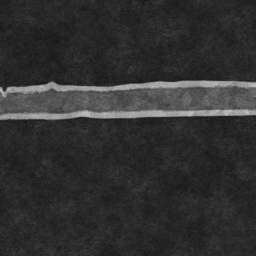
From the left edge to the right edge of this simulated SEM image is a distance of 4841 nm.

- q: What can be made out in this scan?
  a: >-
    one or a few lines or trenches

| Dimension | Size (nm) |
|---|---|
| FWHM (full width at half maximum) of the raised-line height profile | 533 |